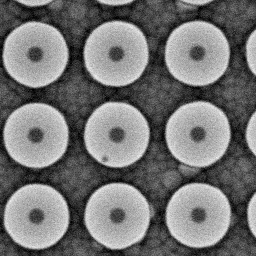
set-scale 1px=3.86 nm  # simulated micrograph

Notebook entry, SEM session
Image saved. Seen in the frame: an array of small figures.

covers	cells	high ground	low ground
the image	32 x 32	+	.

...+++.......++.................
................................
................................
..+++++.....+++++.....+++++.....
.+++++++...+++++++...+++++++...+
.+++++++...+++++++...+++++++...+
++++++++...+++++++...++++++++..+
++++++++...+++++++...++++++++..+
.+++++++...+++++++...+++++++...+
.++++++.....+++++.....++++++....
...+++.......+++.......+++......
................................
................................
..+++++.....+++++......++++.....
.+++++++...+++++++...+++++++....
.+++++++...+++++++...++++++++..+
.+++++++...++++++++..++++++++..+
.+++++++...++++++++..++++++++..+
.+++++++...+++++++...+++++++...+
.+++++++....++++++....++++++....
...+++.......+++.......+++......
................................
................................
...+++.......++++......++++.....
..++++++....++++++....++++++....
.+++++++...+++++++...++++++++..+
.++++++++..++++++++..++++++++..+
.++++++++..++++++++..++++++++..+
.+++++++...+++++++...+++++++...+
.+++++++....++++++....++++++....
...++++......++++......++++.....
................................